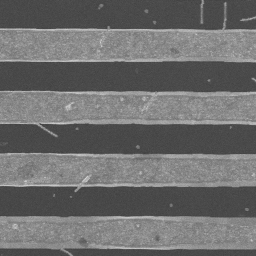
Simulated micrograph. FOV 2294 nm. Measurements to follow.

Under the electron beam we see wiring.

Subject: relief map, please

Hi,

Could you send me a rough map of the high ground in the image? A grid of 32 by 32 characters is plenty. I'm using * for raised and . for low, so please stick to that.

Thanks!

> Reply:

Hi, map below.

................................
................................
................................
................................
********************************
********************************
********************************
*..******......................*
................................
................................
................................
********........................
********************************
********************************
********************************
....*...........................
................................
................................
................................
**************..................
********************************
********************************
********************************
................................
................................
................................
................................
*************************.......
********************************
********************************
********************************
................................